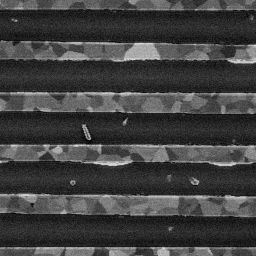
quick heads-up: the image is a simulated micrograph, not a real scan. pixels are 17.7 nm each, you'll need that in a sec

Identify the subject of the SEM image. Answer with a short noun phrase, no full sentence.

lines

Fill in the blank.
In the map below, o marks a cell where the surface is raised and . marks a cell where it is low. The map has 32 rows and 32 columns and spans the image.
oooooooooooooooooooooooooooooooo
................................
................................
................................
................................
oooooooooooooooooooooo..........
oooooooooooooooooooooooooooooooo
................................
................................
................................
................................
................................
oooooooooooooooooooooooooooooooo
oooooooooooooooooooooooooooooooo
................................
................................
................................
................................
oooooooooooooooooooooooooooooooo
oooooooooooooooooooooooooooooooo
................................
................................
................................
................................
ooooooooooooooooo...............
oooooooooooooooooooooooooooooooo
..oooooooooooooooooooooooooooooo
................................
................................
................................
................................
oooooooooooooooooooooooooooooooo